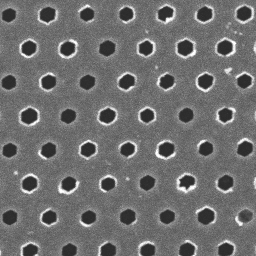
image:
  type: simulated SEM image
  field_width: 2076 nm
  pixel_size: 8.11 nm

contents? a regular array of holes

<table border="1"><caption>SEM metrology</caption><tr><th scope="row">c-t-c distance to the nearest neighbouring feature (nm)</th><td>314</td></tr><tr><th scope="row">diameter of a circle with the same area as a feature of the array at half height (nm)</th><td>121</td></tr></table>